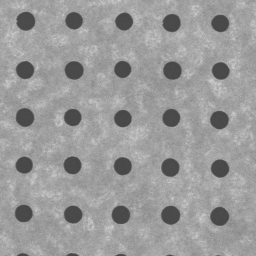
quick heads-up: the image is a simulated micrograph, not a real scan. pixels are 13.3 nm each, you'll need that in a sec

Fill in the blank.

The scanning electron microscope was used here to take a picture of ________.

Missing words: a regular array of holes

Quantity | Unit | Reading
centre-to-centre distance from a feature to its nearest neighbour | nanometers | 629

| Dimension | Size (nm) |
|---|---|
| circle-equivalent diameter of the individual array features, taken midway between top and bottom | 239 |